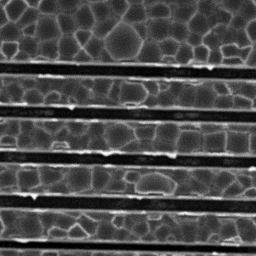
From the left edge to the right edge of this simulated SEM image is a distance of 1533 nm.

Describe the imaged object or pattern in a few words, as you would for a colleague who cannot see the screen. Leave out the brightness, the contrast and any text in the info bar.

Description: parallel lines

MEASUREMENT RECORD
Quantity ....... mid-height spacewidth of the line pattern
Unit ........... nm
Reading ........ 71.9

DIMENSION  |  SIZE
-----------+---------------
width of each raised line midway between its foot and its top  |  192 nm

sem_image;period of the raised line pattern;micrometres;0.268